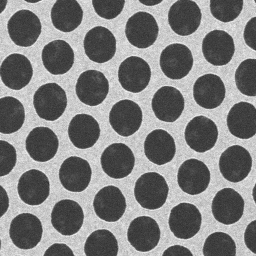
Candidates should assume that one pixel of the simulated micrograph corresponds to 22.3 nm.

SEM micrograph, a regular array of holes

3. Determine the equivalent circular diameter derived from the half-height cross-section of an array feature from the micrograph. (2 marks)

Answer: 0.793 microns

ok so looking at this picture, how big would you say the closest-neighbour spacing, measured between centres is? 0.973 microns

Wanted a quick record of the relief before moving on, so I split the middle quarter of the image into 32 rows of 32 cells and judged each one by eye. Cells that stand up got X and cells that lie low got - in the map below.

--XXXXXXXXXXXX-------XXX--------
-XXXXX--XXXXX---------XX--------
XXXX------XXX---------XXX------X
XXX--------XX---------XXXX----XX
XXX--------XXX-------XXXXXXXXXXX
XXX--------XXX-------XXXX--XXXXX
XXX--------XXXX-----XXX------XXX
-XX--------XXXXXXXXXXX-------XXX
-XX-------XXXXXXXXXXXX--------XX
-XXX------XXX-----XXXX--------XX
-XXXXX--XXXX-------XXX--------XX
XXXXXXXXXXXX-------XXX--------XX
XXX---XXXXX---------XXX------XXX
XX------XXX---------XXX------XXX
X-------XXX---------XXXXX--XXXX-
X--------XXX-------XXXXXXXXXXX--
X--------XXX-------XXX---XXXXX--
X--------XXXX----XXXX------XXX--
X--------XXXXXXXXXXX-------XXX--
XX------XXXXXXXXXXXX--------XX--
XX-----XXXX-----XXXX--------XXX-
XXXXXXXXXX-------XXX--------XXXX
XXXXXXXXX--------XXX--------XXXX
X----XXXX---------XXX------XXXXX
------XXX---------XXXX-----XXX--
-------XX---------XXXXXXXXXXX---
-------XXX-------XXXXXXXXXXX----
-------XXX-------XXX----XXXX----
-------XXXXX---XXX-------XXX----
-------XXXXXXXXXXX--------XX----
------XXXX---XXXXX--------XXX---
X----XXXX-----XXX---------XXX---